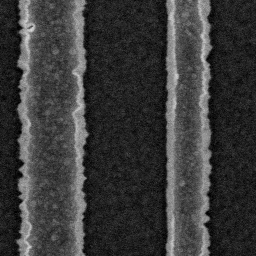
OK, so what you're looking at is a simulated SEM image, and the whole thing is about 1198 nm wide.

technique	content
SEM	one or a few lines or trenches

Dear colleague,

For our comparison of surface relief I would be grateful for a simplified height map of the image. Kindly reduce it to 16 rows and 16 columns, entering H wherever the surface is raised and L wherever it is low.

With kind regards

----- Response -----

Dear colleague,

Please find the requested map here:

LHHHHLLLLLLHHLLL
LHHHHLLLLLLHHLLL
LHHHHLLLLLLHHLLL
LHHHHLLLLLLHHLLL
LHHHHLLLLLLHHLLL
LHHHHLLLLLLHHLLL
LHHHHLLLLLLHHLLL
LHHHHLLLLLLHHLLL
LHHHHLLLLLLHHLLL
LHHHHLLLLLLHHLLL
LHHHHLLLLLLHHLLL
LHHHHLLLLLLHHLLL
LHHHHLLLLLLHHLLL
LHHHHLLLLLLHHLLL
LHHHHLLLLLLHHLLL
LHHHHLLLLLLHHLLL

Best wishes